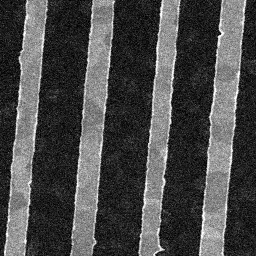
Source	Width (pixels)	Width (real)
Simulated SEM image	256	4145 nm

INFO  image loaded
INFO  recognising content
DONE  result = one or a few lines or trenches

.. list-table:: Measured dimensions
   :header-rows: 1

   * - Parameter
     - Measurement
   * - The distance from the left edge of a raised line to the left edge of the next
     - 1060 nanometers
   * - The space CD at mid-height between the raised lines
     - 0.746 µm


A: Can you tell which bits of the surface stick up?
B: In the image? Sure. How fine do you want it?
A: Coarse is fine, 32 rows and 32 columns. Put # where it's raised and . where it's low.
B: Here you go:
...###......##......##......###.
...###.....###......##......##..
...###.....###......##......##..
...###.....###......##.....###..
...##......###......##.....###..
...##......###......##.....###..
...##......###......##.....###..
..###......###......##.....###..
...##......###......##.....###..
...##......##......###.....###..
...##......##......##......###..
..###......##......##......###..
..###......##......##......###..
..###.....###......##......##...
..###.....###......##.....###...
..###.....###......##.....###...
..##......###......##.....###...
..##......###......##.....###...
..##......###......##.....###...
..##......###......##.....###...
..##......###.....###.....###...
.###......##......###.....###...
.###......##......###.....###...
.###......##......##......##....
.###.....###......##......##....
.###.....###......##......##....
.##......###......##.....###....
.##......###......##.....###....
.##......###......##.....###....
.##......###......##.....###....
.##......###......##.....###....
.##......##......###.....###....